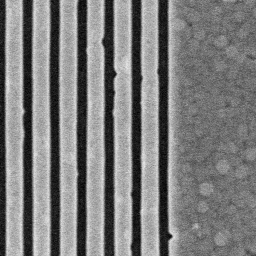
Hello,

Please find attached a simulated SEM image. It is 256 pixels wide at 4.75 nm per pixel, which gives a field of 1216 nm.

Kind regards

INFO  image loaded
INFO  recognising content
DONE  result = parallel lines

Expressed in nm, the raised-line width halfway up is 80.1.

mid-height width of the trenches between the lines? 47.5 nanometres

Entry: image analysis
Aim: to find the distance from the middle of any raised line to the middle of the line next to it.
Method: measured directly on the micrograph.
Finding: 129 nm